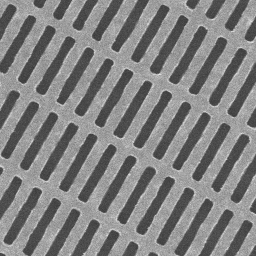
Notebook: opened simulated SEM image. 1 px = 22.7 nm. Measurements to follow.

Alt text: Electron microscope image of a regular array of holes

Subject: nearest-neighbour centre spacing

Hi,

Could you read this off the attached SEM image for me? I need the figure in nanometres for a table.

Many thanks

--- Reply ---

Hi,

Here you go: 503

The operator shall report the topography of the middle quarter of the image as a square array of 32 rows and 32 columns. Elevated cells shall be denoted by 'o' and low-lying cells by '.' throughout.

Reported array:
ooo...ooo...oooooooooo...ooo...o
oo...oooo...ooo..ooooo..ooo....o
oo...ooo...ooo...oooooooooo...oo
o...oooo...ooo...ooooooooo....oo
....ooo...ooo...oooo.oooooo..ooo
...ooo...oooo...ooo...oooooooooo
..oooo...ooo...oooo...ooooooooo.
..ooo...oooo...ooo...ooo...ooooo
.oooo...ooo...ooo...oooo...ooooo
oooo...ooo....ooo...ooo...oooo.o
ooo...oooo...ooo...oooo...ooo...
ooo...ooo...oooo...ooo...ooo....
ooo..oooo...ooo...oooo...ooo...o
oooooooo...ooo....ooo...ooo...oo
oooooooo..oooo...ooo...oooo...oo
o..ooooo..ooo....ooo...ooo...ooo
...oooooooooo...ooo...oooo...ooo
...ooo.ooooo...ooo....ooo...ooo.
..oooo..oooooooooo...oooo...ooo.
.oooo...ooooooooo....ooo...ooo..
.ooo...oooo..ooooo..ooo...oooo..
.ooo...ooo...oooooooooo...ooo...
ooo...oooo...ooooooooo...oooo...
ooo...ooo...oooo..ooooo..ooo...o
oo...oooo...ooo...oooooooooo..oo
oo...ooo...ooo...oooooooooo...oo
o...ooo...oooo...ooo...ooooo.ooo
....ooo...ooo...ooo....ooooooooo
...ooo...oooo...ooo...ooo..ooooo
...oo....ooo...ooo....ooo...oooo
..ooo...ooo....ooo...ooo...ooooo
.ooo....ooo...ooo...oooo..oooo..